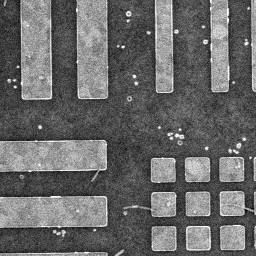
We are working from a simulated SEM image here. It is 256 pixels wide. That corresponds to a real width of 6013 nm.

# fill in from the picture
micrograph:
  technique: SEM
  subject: groups of lines, slits or small figures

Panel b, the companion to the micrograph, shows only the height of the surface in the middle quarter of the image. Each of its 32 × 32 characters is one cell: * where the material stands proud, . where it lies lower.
....*******............****.....
....*******............****.....
....*******............****.....
....*******............****.....
....*******............****.....
....*******............****.....
....*******............****.....
....*******.....................
....******......................
................................
................................
................................
................................
................................
................................
................................
................................
................................
.............................*..
**********......................
**********......................
**********......................
**********......................
**********......................
**********............******...*
**********............******...*
........*.............******...*
......................******...*
......................******...*
................................
................................
................................